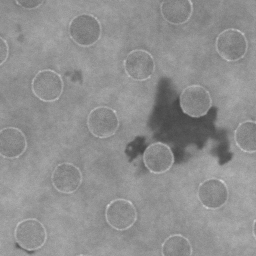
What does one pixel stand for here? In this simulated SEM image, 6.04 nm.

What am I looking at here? a regular array of raised bodies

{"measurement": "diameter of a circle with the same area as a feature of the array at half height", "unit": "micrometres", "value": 0.186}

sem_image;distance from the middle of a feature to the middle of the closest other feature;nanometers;395